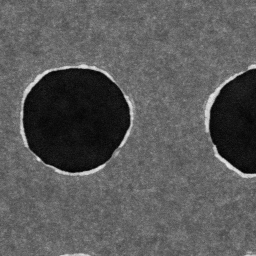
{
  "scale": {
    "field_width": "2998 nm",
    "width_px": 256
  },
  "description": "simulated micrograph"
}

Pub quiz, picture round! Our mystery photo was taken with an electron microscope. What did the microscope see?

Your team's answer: holes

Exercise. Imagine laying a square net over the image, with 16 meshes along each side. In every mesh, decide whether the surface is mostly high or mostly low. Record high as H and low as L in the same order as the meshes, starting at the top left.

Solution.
HHHHHHHHHHHHHHHH
HHHHHHHHHHHHHHHH
HHHHHHHHHHHHHHHH
HHHHHHHHHHHHHHHH
HHHLLLHHHHHHHHHL
HHLLLLLHHHHHHHLL
HLLLLLLLHHHHHLLL
HLLLLLLLHHHHHLLL
HHLLLLLLHHHHHLLL
HHLLLLLHHHHHHHLL
HHHLLLHHHHHHHHHL
HHHHHHHHHHHHHHHH
HHHHHHHHHHHHHHHH
HHHHHHHHHHHHHHHH
HHHHHHHHHHHHHHHH
HHHHHHHHHHHHHHHH